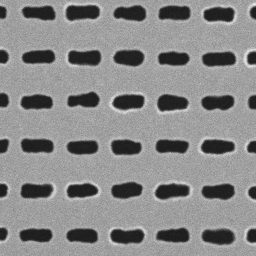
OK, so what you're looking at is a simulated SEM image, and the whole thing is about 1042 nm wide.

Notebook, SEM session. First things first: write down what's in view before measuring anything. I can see a regular array of holes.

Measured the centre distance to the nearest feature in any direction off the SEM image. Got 178 nm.